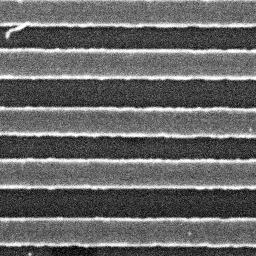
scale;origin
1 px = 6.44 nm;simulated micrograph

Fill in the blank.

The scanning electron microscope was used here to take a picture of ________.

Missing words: lines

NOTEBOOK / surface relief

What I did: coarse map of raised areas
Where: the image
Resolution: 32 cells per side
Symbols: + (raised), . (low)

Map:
++++++++++++++++++++++++++++++++
++++++++++++++++++++++++++++++++
++++++++++++++++++++++++++++++++
................................
................................
................................
++++++++++++++++++++++++++++++++
++++++++++++++++++++++++++++++++
++++++++++++++++++++++++++++++++
++++++++++++++++++++++++++++++++
................................
................................
................................
+..+.+..........................
++++++++++++++++++++++++++++++++
++++++++++++++++++++++++++++++++
++++++++++++++++++++++++++++++++
................................
................................
................................
++++++++++++++++++++++++++++++++
++++++++++++++++++++++++++++++++
++++++++++++++++++++++++++++++++
......+....+.+..........+++.++.+
................................
................................
................................
++++++++++++++++++++++++++++++++
++++++++++++++++++++++++++++++++
++++++++++++++++++++++++++++++++
++++++++++++++++++++++++++++++++
................................